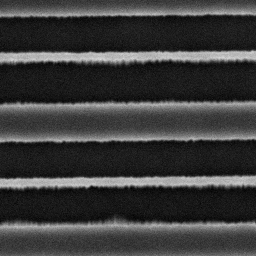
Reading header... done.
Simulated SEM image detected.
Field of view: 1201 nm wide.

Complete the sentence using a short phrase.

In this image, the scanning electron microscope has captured lines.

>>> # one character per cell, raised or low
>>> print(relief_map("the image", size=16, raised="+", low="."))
++++++++++++++++
................
................
................
................
................
......+.++++++++
++++++++++++++++
++++++++++++++++
................
................
.+..............
................
................
++++++++++++++++
++++++++++++++++